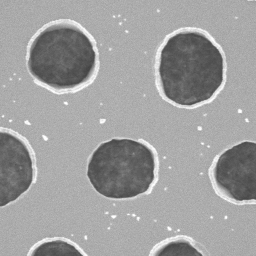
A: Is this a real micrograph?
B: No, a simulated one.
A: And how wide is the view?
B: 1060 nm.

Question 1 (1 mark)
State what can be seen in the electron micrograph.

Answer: holes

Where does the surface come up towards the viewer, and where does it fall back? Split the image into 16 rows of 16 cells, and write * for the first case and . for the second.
****************
****************
**....*****..***
**....****....**
**....****....**
**********....**
***********.****
****************
.***************
..****...*****..
..****....****..
..****...*****..
.***************
****************
****************
**...*****..****